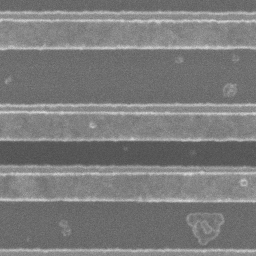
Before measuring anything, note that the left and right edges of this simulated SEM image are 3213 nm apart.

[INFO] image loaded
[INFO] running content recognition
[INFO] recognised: lines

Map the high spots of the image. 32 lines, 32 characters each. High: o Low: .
................................
................................
oooooooooooooooooooooooooooooooo
oooooooooooooooooooooooooooooooo
oooooooooooooooooooooooooooooooo
oooooooooooooooooooooooooooooooo
................................
................................
................................
................................
................................
................................
................................
oooooooooooooooooooooooooooooooo
oooooooooooooooooooooooooooooooo
oooooooooooooooooooooooooooooooo
oooooooooooooooooooooooooooooooo
oooooooooooooooooooooooooooooooo
................................
................................
................................
oooooooooooooooooooooooooooooooo
oooooooooooooooooooooooooooooooo
oooooooooooooooooooooooooooooooo
oooooooooooooooooooooooooooooooo
................................
................................
................................
................................
................................
................................
oooooooooooooooooooooooooooooooo